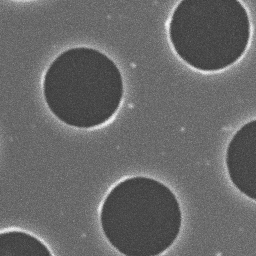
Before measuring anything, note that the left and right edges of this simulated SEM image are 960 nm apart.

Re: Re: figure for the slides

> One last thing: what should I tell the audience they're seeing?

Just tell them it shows holes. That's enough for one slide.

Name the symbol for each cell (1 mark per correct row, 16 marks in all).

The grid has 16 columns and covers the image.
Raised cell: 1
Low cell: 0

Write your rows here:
1111111111100001
1111111111100000
1111111111100000
1111000111100001
1110000111111111
1110000011111111
1110000111111111
1111000111111111
1111111111111110
1111111111111100
1111111111111100
1111111000111110
1111111000011111
1111110000011111
1111110000011111
0001111000111111